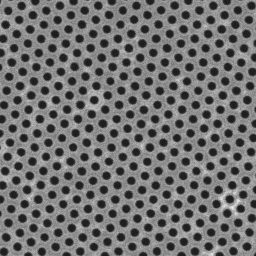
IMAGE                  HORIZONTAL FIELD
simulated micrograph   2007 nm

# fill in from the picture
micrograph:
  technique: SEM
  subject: a regular array of holes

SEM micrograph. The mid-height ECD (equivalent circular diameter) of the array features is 64.4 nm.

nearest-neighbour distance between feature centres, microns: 0.111